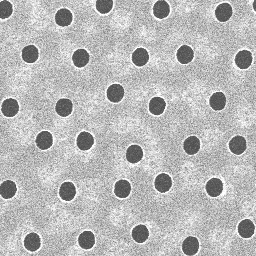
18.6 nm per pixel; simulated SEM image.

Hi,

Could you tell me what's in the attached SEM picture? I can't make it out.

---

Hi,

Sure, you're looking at a regular array of holes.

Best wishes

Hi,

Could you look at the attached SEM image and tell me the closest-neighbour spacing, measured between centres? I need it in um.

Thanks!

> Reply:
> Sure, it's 0.863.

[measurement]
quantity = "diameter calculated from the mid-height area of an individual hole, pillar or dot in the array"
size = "18.5 px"